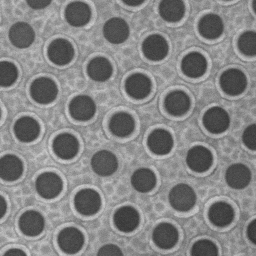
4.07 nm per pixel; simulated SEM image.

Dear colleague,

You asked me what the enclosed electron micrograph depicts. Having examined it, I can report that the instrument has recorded a regular array of holes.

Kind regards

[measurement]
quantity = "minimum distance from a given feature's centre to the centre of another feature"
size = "171 nm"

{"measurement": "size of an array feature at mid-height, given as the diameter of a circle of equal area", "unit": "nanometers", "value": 112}